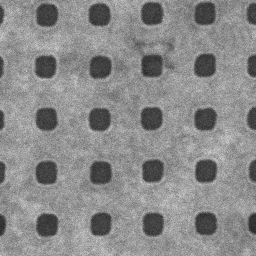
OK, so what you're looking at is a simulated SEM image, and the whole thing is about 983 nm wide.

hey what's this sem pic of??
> a regular array of holes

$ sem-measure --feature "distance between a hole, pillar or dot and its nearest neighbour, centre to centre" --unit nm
200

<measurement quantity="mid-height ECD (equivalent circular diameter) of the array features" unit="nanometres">98.7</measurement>